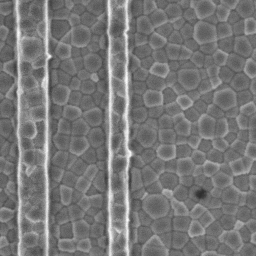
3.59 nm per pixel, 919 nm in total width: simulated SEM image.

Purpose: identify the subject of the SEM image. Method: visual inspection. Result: one or a few lines or trenches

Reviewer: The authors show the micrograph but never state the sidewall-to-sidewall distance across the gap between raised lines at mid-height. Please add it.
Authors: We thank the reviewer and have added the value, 62.1 px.